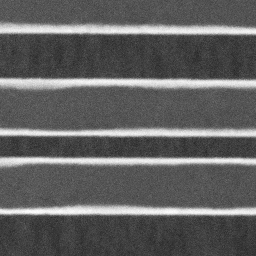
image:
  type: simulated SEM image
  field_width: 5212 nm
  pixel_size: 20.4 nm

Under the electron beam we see lines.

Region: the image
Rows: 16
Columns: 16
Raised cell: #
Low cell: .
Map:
################
################
................
................
................
################
################
################
................
................
################
################
################
................
................
................